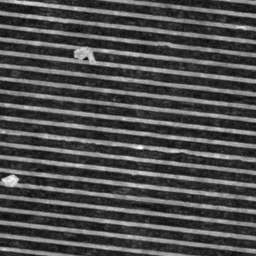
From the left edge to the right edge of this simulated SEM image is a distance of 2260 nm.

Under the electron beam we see parallel lines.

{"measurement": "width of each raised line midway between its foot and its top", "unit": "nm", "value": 29.6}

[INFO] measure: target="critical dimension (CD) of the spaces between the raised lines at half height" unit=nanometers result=83.3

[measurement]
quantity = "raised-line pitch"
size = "115 nm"